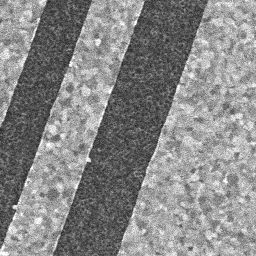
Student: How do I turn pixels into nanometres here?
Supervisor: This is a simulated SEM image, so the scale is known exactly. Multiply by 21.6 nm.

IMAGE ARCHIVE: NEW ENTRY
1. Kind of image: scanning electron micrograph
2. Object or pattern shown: one or a few lines or trenches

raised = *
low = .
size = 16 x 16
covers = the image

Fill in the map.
***..****....***
**...***.....***
**...***....****
**...***....****
*...***....*****
*...***....*****
*..****....*****
...***....******
...***....******
..****....******
..***....*******
..***....*******
.****....*******
.***....********
****....********
***....*********